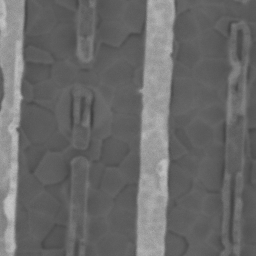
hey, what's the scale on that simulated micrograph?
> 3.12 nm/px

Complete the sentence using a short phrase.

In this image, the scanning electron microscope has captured one or a few lines or trenches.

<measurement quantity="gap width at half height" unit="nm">173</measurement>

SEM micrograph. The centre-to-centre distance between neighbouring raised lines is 0.239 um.